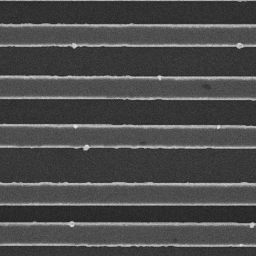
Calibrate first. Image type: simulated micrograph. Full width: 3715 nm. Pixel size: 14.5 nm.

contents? lines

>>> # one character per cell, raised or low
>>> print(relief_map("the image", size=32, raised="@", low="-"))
--------------------------------
--------------------------------
--------------------------------
@@@@@@@@@@@@@@@@@@@@@@@@@@@@@@@@
@@@@@@@@@@@@@@@@@@@@@@@@@@@@@@@@
@@@@@@@@@@@@@@@@@@@@@@@@@@@@@@@@
--------------------------------
--------------------------------
--------------------------------
--------------------------------
@@@@@@@@@@@@@@@@@@@@@@@@@@@@@@@@
@@@@@@@@@@@@@@@@@@@@@@@@@@@@@@@@
--------------------------------
--------------------------------
--------------------------------
--------------------------------
@@@@@@@@@@@@@@@@@@@@@@@@@@@@@@@@
@@@@@@@@@@@@@@@@@@@@@@@@@@@@@@@@
---------@@@--@---@@@@@@@@@@@@@@
--------------------------------
--------------------------------
--------------------------------
--------------------------------
@@@@@@@@@@@@@@@@@@@@@@@@@@@@@@@@
@@@@@@@@@@@@@@@@@@@@@@@@@@@@@@@@
@@@@@@@@@@@@@@@@@@@@@@@@@@@@@@@@
--------------------------------
--------------------------------
@@@@@@@@@@@@@@@@@@@@@@@@@@@@@@@@
@@@@@@@@@@@@@@@@@@@@@@@@@@@@@@@@
@@@@@@@@@@@@@@@@@@@@@@@@@@@@@@@@
--------------------------------